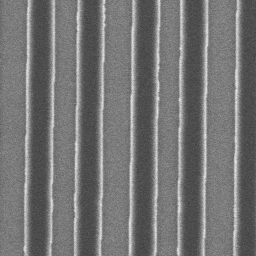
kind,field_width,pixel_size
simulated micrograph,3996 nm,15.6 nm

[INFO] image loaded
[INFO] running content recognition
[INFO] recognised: lines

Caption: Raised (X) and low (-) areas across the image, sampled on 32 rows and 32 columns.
----XXX---XXX----XXX---XXX----XX
---XXXX---XXX----XXX---XXX----XX
---XXXX---XXX----XXX---XXX----XX
---XXXX---XXX----XXX---XXX----XX
---XXXX---XXX----XXX---XXX----XX
---XXXX---XXX----XXX---XXX----XX
---XXXX---XXX----XXX---XXX----XX
---XXXX---XXX----XXX---XXX----XX
---XXXX---XXX----XXX---XXX---XXX
---XXXX---XXX----XXX---XXX---XXX
---XXXX---XXX----XXX---XXX---XXX
---XXXX---XXX----XXX---XXX---XXX
---XXXX---XXX---XXXX--XXXX---XXX
---XXXX---XXX---XXXX---XXX---XXX
---XXXX---XXX---XXXX---XXX---XXX
---XXXX---XXX---XXXX--XXXX---XXX
---XXXX---XXX---XXXX--XXXX---XXX
---XXXX--XXXX---XXXX--XXXX---XXX
---XXXX--XXXX---XXXX--XXXX---XXX
---XXXX--XXXX---XXXX--XXXX---XXX
---XXXX--XXXX---XXXX--XXXX---XXX
---XXXX--XXXX---XXXX--XXXX---XXX
---XXXX--XXXX---XXXX--XXXX---XXX
---XXX---XXXX---XXXX--XXXX---XXX
---XXX---XXXX---XXXX--XXXX---XXX
---XXXX--XXXX---XXXX--XXXX---XXX
---XXXX--XXXX---XXX---XXXX---XXX
---XXX---XXXX---XXX---XXXX---XXX
---XXX---XXXX---XXX---XXXX---XXX
---XXX---XXXX---XXX---XXXX---XXX
---XXX---XXXX---XXX---XXX----XXX
---XXX---XXXX---XXX---XXX----XXX